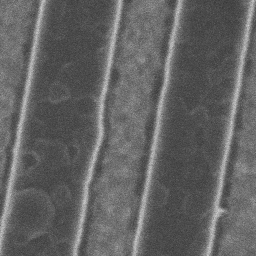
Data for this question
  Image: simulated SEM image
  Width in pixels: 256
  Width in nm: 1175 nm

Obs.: one or a few lines or trenches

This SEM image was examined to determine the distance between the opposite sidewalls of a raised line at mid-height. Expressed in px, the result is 75.8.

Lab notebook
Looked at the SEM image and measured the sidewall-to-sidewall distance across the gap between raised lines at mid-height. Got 260 nm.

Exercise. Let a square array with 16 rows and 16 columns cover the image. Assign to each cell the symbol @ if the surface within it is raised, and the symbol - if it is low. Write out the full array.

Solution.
---@@@@----@@@@@
--@@@@@----@@@@@
--@@@@@----@@@@-
--@@@@@----@@@@-
--@@@@@---@@@@@-
--@@@@@---@@@@@-
-@@@@@----@@@@@-
-@@@@@----@@@@@-
-@@@@@----@@@@--
-@@@@@----@@@@--
-@@@@@---@@@@@--
-@@@@@---@@@@@--
@@@@@----@@@@@--
@@@@@----@@@@@--
@@@@@----@@@@---
@@@@@---@@@@@---